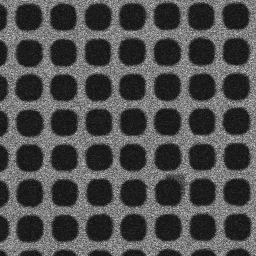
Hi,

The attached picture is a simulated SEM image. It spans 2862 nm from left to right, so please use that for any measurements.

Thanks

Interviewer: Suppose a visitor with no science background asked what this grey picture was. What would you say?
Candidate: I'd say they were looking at a regular array of holes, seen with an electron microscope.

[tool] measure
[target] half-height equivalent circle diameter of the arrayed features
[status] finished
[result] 316 nanometres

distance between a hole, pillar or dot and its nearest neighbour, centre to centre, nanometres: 384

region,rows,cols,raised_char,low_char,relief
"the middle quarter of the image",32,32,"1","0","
01111110001111110011111110111111
11111111111111111111111111111111
11111111111111110001111100001111
00111100000111000000111000000111
00011000000011000000010000000110
00011000000011000000010000000110
00011000000011000000010000000110
00011000000011000000111000000110
00111100000111100000111000001111
11111111111111111111111111111111
11111111111111111111111111111111
00111110000111100000111000001111
00011100000011000000111000000111
00011000000011000000011000000110
00011000000011000000011000000110
00011000000011000000011000000110
00011100000011000000111000000111
00111100000111100000111100001111
11111111111111111111111111111111
11111111111111111111111111111111
00111100000111100001111100001111
00011100000011000000111000000110
00001000000011000000011000000110
00001000000011000000011000000110
00001000000011000000011000000110
00011100000011000000111000000111
00111110001111110001111100001111
11111111111111111111111111111111
11111111111111111111111111111111
00011110000111100000111100001111
00011100000011000000111000000110
00001100000011000000011000000110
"